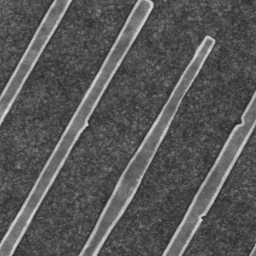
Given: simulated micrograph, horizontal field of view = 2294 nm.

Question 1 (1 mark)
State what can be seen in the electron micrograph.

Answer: one or a few lines or trenches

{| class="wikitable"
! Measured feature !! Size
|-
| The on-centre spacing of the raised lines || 658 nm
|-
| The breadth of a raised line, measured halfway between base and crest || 115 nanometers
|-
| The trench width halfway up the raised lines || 540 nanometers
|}